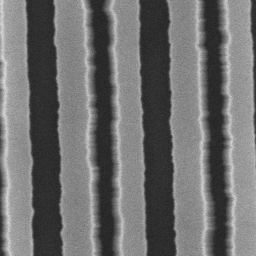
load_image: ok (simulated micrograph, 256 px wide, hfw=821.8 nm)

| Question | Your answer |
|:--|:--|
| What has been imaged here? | lines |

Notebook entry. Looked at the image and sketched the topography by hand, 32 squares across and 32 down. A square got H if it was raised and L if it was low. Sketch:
HHHLLLLHHHHLLLHHHLLLLHHHHLLLHHHL
HHHLLLLHHHHLLLHHHLLLLHHHHLLLHHHL
HHHLLLLHHHHLLLHHHLLLLHHHHLLLHHHL
HHHLLLLHHHHLLLHHHLLLLHHHHLLLHHHL
HHHLLLLHHHHLLLHHHLLLLHHHHLLLHHHL
HHHLLLLHHHHLLLHHHLLLLHHHHLLLHHHH
HHHLLLLHHHHLLLHHHLLLLHHHHLLLHHHH
HHHLLLLHHHHLLLHHHLLLLHHHHLLLHHHH
HHHLLLLHHHHLLLHHHLLLLHHHHLLLHHHH
HHHLLLLHHHHLLLHHHHLLLHHHHLLLHHHH
HHHHLLLHHHHLLLHHHHLLLHHHHLLLHHHH
HHHHLLLHHHHLLLHHHHLLLHHHHLLLHHHH
HHHHLLLHHHHLLLHHHHLLLHHHHLLLHHHH
HHHHLLLHHHHLLLHHHHLLLHHHHLLLHHHH
HHHHLLLHHHHHLLLHHHLLLHHHHLLLHHHH
HHHHLLLHHHHHLLHHHHLLLHHHHLLLHHHH
LHHHLLLHHHHLLLHHHHLLLHHHHHLLHHHH
HHHHLLLHHHHLLLHHHHLLLLHHHHLLLHHH
LHHHLLLHHHHLLLHHHHLLLLHHHHLLLHHH
HHHHLLLLHHHLLLLHHHLLLLHHHHLLHHHH
HHHHLLLLHHHHLLLHHHLLLLHHHHLLLHHH
LHHHLLLLHHHHLLLHHHLLLLHHHHLLLHHH
LHHHLLLLHHHHLLLHHHLLLLHHHHLLLHHH
LHHHLLLLHHHHLLLHHHLLLLHHHHLLLHHH
LHHHLLLLHHHHLLLHHHLLLLHHHHLLLHHH
LHHHLLLLHHHHLLLHHHLLLLHHHHLLLHHH
LHHHLLLLHHHHLLLHHHLLLLHHHHLLLHHH
LHHHLLLLHHHHLLLHHHLLLLHHHHLLLHHH
LHHHLLLLHHHHLLLHHHLLLLHHHHLLLHHH
LHHHLLLLHHHHLLLHHHLLLLHHHHLLLHHH
LHHHLLLLHHHHLLLHHHLLLLHHHHLLLHHH
LHHHLLLLHHHHLLLHHHLLLLHHHHLLLHHH